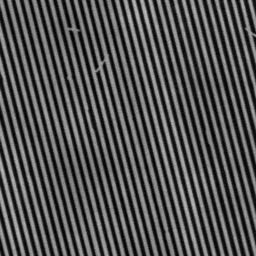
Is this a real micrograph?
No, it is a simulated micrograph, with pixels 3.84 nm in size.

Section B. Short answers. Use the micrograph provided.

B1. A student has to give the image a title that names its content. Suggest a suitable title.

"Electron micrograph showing parallel lines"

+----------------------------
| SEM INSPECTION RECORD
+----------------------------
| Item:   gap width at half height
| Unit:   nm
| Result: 14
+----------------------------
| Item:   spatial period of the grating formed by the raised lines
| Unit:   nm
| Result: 30.9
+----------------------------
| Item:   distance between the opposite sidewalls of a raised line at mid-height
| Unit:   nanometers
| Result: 16.8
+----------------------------